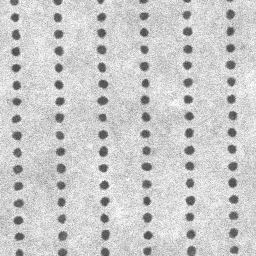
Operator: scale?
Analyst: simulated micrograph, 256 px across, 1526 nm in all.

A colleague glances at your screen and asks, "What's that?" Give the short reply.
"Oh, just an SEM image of a regular array of holes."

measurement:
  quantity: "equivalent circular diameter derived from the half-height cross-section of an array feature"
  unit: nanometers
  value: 57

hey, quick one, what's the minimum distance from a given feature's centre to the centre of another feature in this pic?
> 98.7 nanometres